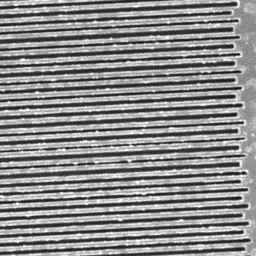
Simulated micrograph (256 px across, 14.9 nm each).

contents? parallel lines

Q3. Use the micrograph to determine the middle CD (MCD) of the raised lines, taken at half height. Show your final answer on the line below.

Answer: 65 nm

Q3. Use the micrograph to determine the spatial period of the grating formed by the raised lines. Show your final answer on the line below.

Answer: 126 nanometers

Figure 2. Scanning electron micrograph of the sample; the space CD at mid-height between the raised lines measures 0.0632 um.